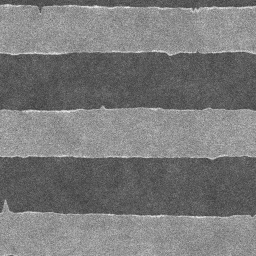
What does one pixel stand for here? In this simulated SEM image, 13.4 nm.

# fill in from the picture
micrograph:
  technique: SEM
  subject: one or a few lines or trenches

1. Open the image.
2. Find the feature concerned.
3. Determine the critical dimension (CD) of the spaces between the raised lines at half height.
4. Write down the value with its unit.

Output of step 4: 768 nanometers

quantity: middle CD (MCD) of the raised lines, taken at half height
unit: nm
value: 624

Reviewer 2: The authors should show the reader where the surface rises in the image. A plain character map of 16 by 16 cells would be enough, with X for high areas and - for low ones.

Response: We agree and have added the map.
XX-XXXXXXX---XXX
XXXXXXXXXXXXXXXX
XXXXXXXXXXXXXXXX
----------------
----------------
----------------
----------------
XXXXXXXXXXXXXXXX
XXXXXXXXXXXXXXXX
XXXXXXXXXXXXXXXX
----------------
----------------
----------------
XXXXXXXXXXX----X
XXXXXXXXXXXXXXXX
XXXXXXXXXXXXXXXX